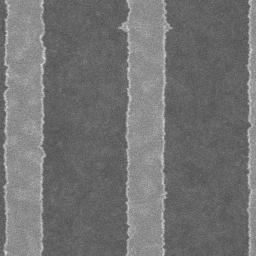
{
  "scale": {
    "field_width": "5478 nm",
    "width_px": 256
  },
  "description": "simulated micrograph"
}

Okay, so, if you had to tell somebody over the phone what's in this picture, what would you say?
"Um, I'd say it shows one or a few lines or trenches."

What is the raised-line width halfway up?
765 nm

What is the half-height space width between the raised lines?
85.8 pixels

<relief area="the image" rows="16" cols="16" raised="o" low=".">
ooo.....oo......
ooo.....oo......
ooo.....oo......
ooo.....oo......
ooo.....oo......
ooo.....oo......
ooo.....oo......
ooo.....oo......
ooo.....oo......
ooo.....oo......
ooo.....oo......
ooo.....oo......
ooo.....oo......
ooo.....oo......
ooo.....oo......
ooo.....oo......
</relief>